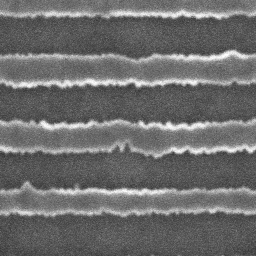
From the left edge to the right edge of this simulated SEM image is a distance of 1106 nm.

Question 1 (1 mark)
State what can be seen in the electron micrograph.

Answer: one or a few lines or trenches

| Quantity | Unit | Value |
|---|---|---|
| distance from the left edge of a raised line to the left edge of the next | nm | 284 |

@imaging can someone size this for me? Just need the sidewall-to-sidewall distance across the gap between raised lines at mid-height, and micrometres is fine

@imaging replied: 0.168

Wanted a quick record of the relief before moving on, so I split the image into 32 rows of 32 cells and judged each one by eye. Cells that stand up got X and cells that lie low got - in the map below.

XXXXXXXXXXXXXXXXXXXXXXXXXXXXXXXX
XXXXXXXXXXXXXXXXXXXXXXXXXXXXXXXX
--------------------------------
--------------------------------
--------------------------------
--------------------------------
----------------------------X---
XXXXXXXXXXXXXXXXXXXXXXXXXXXXXXXX
XXXXXXXXXXXXXXXXXXXXXXXXXXXXXXXX
XXXXXXXXXXXXXXXXXXXXXXXXXXXXXXXX
-XXXXXXXXXXXXXXX-XXX--------X---
--------------------------------
--------------------------------
--------------------------------
--------------------------------
XXXXXX--X-XXXXXXXX-X----XXXXXXXX
XXXXXXXXXXXXXXXXXXXXXXXXXXXXXXXX
XXXXXXXXXXXXXXXXXXXXXXXXXXXXXXXX
XXXXXXXXXXXXXX--XXXXXXXXXXXXXXXX
-------------------X------------
--------------------------------
--------------------------------
--------------------------------
--XX--------------------------X-
XXXXXXXXXXXXXXXXXXXXXXXXXXXXXXXX
XXXXXXXXXXXXXXXXXXXXXXXXXXXXXXXX
XXXXXXXXXXXXXXXXXXXXXXXXX-X--XXX
--------------------------------
--------------------------------
--------------------------------
--------------------------------
--------------------------------